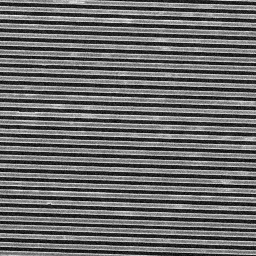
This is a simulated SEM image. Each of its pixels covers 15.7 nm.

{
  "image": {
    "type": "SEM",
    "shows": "parallel lines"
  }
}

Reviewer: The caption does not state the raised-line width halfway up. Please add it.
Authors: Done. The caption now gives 68.6 nm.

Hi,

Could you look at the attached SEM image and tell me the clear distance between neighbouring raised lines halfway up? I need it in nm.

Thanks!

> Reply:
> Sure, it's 66.6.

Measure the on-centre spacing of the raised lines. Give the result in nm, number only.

137